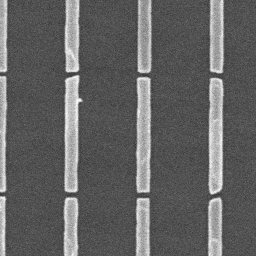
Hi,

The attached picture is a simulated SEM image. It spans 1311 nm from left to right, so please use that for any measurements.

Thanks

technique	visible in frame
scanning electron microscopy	wiring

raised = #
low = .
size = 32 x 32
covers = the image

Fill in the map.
#.......##.......##........#....
#.......##.......##.......##....
#.......##.......##.......##....
#.......##.......##.......##....
#.......##.......##.......##....
#.......##.......##.......##....
#.......##.......##.......##....
#.......##.......##.......##....
#.......##.......##.......##....
................................
#.......##.......##.......##....
#.......##.......##.......##....
#.......##.......##.......##....
#.......##.......##.......##....
#.......##.......##.......##....
#.......##.......##.......##....
#.......##.......##.......##....
#.......##.......##.......##....
#.......##.......##.......##....
#.......##.......##.......##....
#.......##.......##.......##....
#.......##.......##.......##....
#.......##.......##.......##....
#.......##.......##.......#.....
................................
#.......##.......##.......##....
#.......##.......##.......##....
#.......##.......##.......##....
#.......#........##.......##....
........##.......#........##....
........##.......##.......##....
#.......##.......##.......##....